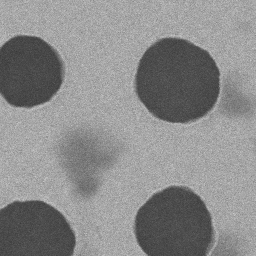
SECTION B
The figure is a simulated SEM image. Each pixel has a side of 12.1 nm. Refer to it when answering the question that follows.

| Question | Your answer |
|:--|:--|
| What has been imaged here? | holes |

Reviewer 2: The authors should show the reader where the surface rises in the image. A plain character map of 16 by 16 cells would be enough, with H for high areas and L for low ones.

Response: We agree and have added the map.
HHHHHHHHHHHHHHHH
HHHHHHHHHHHHHHHH
HLLHHHHHHHLLHHHH
LLLLHHHHHLLLLHHH
LLLLHHHHHLLLLLHH
LLLLHHHHHLLLLLHH
HLLHHHHHHLLLLHHH
HHHHHHHHHHLLHHHH
HHHHHHHHHHHHHHHH
HHHHHHHHHHHHHHHH
HHHHHHHHHHHHHHHH
HHHHHHHHHHHHHHHH
HHHHHHHHHLLLLHHH
LLLLHHHHHLLLLHHH
LLLLLHHHLLLLLHHH
LLLLLHHHHLLLLHHH